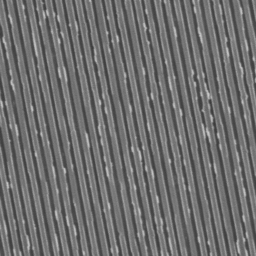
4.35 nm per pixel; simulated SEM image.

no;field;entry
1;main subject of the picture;parallel lines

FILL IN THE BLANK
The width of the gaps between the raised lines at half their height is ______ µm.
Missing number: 0.016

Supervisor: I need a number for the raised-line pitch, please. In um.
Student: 0.042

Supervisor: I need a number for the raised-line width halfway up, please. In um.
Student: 0.0235